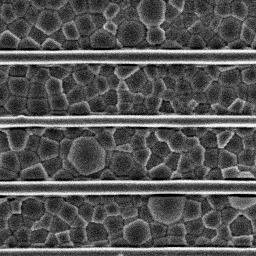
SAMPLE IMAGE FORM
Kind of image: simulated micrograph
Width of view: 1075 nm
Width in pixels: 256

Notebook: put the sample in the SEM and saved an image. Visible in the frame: one or a few lines or trenches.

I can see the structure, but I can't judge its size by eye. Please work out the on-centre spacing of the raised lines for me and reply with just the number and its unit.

274 nm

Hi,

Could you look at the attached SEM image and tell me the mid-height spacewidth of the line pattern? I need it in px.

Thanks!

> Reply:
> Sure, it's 54.5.